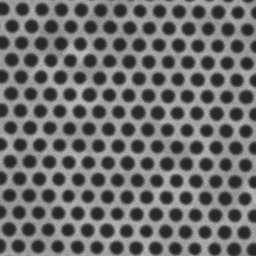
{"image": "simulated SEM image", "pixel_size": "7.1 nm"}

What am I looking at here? a regular array of holes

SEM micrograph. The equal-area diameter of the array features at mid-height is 100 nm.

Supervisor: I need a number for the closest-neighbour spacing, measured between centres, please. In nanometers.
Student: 136